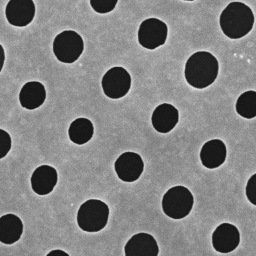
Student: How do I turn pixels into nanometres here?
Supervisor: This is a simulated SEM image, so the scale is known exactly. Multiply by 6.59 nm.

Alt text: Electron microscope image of a regular array of holes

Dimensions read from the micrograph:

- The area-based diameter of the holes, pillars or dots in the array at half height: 30.2 px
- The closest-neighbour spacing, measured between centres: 60.2 px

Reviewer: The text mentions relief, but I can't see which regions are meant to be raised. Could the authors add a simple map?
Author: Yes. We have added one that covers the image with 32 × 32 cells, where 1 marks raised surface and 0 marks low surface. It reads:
10001111111000011111111111111001
10001111111100111111111111110000
10001111111111111100111111100000
11111111111111111000011111110001
11111110001111111000011111110001
11111110001111111100111111111111
01111110001111111111111110111111
01111110011111111111111000011111
11111111111111011111111000011111
11111111111110001111111000011111
11100111111110001111111100111111
11000011111110001111111111111110
11000011111111111111111111111100
11100111111111111111001111111000
11111111111111111110001111111100
11111111100011111110001111111111
01111111100011111111011111111111
01111111100111111111111111011111
01111111111111111111111110001111
01111111111111100111111110001111
11111111111111000011111110001111
11110001111111000011111111111111
11110001111111100111111111111110
11110001111111111111100111111110
11111111111111111111000011111110
11111111110001111111000011111111
11111111110000111111000011111111
00011111110001111111111111111111
00011111110001111111111111100011
00011111111111111001111111100011
11111111111111110000111111100011
11111100111111110000111111100111